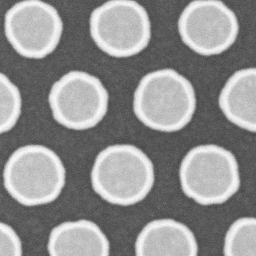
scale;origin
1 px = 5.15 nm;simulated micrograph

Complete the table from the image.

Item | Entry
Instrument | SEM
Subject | a regular array of raised bodies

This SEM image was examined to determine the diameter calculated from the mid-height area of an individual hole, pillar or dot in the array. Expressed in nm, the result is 284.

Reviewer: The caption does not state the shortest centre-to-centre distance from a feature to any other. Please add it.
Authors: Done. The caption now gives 440 nm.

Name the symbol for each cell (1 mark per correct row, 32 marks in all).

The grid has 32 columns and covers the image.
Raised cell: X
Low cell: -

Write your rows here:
---XX---------XXX-------XXXX----
-XXXXXX-----XXXXXX-----XXXXXX---
-XXXXXX-----XXXXXX-----XXXXXX---
-XXXXXX-----XXXXXX-----XXXXXXX--
-XXXXXX-----XXXXXX-----XXXXXX---
--XXXXX-----XXXXXX------XXXXX---
---XXX--------XXX--------XX-----
--------------------------------
--------------------------------
---------XX--------XXX-------XXX
X------XXXXX------XXXXX------XXX
XX-----XXXXXX----XXXXXXX----XXXX
XX-----XXXXXX----XXXXXXX----XXXX
XX-----XXXXXX----XXXXXXX----XXXX
XX-----XXXXX-----XXXXXXX-----XXX
X-------XXX-------XXXXX-------XX
--------------------------------
--------------------------------
----X---------XX---------XX-----
--XXXXX------XXXXX------XXXXX---
-XXXXXX-----XXXXXXX----XXXXXX---
-XXXXXXX----XXXXXXX----XXXXXX---
-XXXXXXX----XXXXXXX----XXXXXXX--
-XXXXXX-----XXXXXXX----XXXXXX---
--XXXXX------XXXXX------XXXX----
--------------------------------
--------------------------------
-------------------------------X
X-------XXXX------XXXXX------XXX
XX-----XXXXXX-----XXXXXX-----XXX
XX----XXXXXXX----XXXXXXX----XXXX
XX----XXXXXXX----XXXXXXX----XXXX